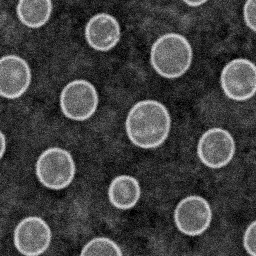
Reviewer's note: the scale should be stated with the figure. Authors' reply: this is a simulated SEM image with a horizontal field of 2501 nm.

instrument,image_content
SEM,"a regular array of raised bodies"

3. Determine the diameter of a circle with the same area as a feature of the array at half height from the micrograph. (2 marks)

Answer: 356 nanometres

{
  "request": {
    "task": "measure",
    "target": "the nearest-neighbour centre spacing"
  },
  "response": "0.704 micrometres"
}